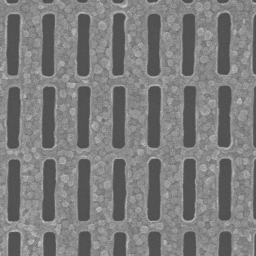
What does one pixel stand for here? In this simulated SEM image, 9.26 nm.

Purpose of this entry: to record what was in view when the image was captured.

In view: a regular array of holes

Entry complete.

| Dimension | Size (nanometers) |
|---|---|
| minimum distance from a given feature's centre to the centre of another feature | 323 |